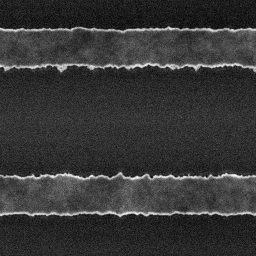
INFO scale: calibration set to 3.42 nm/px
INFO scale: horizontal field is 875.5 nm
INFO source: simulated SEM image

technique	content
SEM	lines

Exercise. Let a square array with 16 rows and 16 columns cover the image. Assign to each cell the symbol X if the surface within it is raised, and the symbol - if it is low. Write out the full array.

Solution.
----------------
----------------
XXXXXXXXXXXXXXXX
XXXXXXXXXXXXXXXX
----------------
----------------
----------------
----------------
----------------
----------------
----------------
XXXXXXXXXXXXXXXX
XXXXXXXXXXXXXXXX
----------------
----------------
----------------